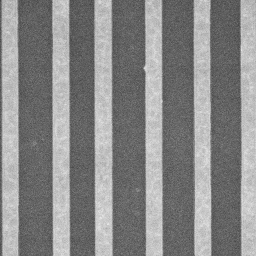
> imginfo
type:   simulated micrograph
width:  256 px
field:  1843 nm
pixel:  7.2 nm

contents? parallel lines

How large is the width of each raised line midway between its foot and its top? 110 nm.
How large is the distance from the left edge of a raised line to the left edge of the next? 345 nm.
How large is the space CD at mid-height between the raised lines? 239 nm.